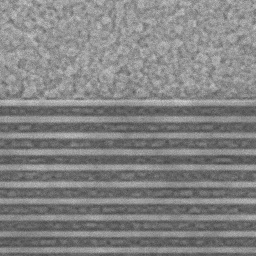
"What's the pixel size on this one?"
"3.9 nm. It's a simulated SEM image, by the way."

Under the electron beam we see parallel lines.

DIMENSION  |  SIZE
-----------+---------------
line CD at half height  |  19 nanometers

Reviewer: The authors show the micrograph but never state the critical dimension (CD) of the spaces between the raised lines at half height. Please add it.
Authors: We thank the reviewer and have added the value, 11.6 pixels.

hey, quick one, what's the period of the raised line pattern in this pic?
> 63.7 nanometres